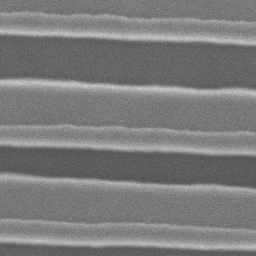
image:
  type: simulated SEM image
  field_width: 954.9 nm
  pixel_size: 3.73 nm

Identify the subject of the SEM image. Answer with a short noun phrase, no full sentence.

lines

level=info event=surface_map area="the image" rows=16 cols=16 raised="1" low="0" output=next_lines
1111111111111111
1111111111111111
0000000000000111
0000000000000000
0000000000000000
1111111100000000
1111111111111111
1111111111111111
1111111111111111
0000000000001111
0000000000000000
1111111100000000
1111111111111111
1111111111111111
1111111111111111
0000000000000000